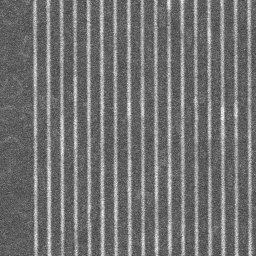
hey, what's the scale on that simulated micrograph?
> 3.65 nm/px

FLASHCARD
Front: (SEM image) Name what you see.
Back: parallel lines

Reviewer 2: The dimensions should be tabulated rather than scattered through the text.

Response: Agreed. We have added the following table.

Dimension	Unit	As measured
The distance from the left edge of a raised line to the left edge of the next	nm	48.8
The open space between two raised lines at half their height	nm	38.3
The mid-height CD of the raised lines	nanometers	9.6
